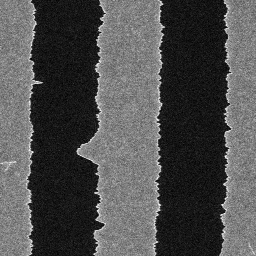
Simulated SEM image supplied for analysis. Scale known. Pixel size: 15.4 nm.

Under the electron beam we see one or a few lines or trenches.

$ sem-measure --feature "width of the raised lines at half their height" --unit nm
940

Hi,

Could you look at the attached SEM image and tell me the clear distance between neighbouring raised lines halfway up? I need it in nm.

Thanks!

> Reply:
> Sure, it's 1030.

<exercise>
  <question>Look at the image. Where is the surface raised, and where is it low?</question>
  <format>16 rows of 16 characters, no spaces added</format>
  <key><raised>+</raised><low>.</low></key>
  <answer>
++....++++....++
++....++++....++
++....++++....++
++....++++....++
++....++++....++
++....++++....++
++....++++....++
++....++++....++
++....++++....++
++...+++++....++
++....++++....++
++....++++....++
++....++++....++
++....++++....++
++....++++....++
++....++++....++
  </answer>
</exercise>